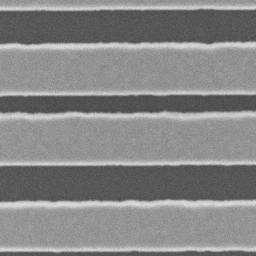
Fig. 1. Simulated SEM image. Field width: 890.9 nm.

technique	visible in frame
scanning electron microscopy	lines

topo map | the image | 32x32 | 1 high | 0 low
11111111111111111111111111111111
00000000000000000000000000000000
00000000000000000000000000000000
00000000000000000000000000000000
00000000000000000000000000000000
00000000000011110011111110011111
11111111111111111111111111111111
11111111111111111111111111111111
11111111111111111111111111111111
11111111111111111111111111111111
11111111111111111111111111111111
11111111111111111111111111111111
00000000000000000000000000000000
00000000000000000000000000000000
11111111111111111111111111111111
11111111111111111111111111111111
11111111111111111111111111111111
11111111111111111111111111111111
11111111111111111111111111111111
11111111111111111111111111111111
11111111111111111111111111111111
00000000000000000000000000000000
00000000000000000000000000000000
00000000000000000000000000000000
00000000000000000000000000000000
01111111111111111111111111111111
11111111111111111111111111111111
11111111111111111111111111111111
11111111111111111111111111111111
11111111111111111111111111111111
11111111111111111111111111111111
00000000000000000000000000000000